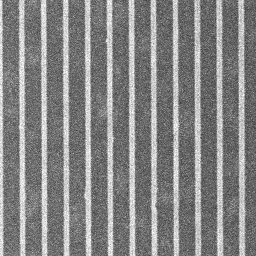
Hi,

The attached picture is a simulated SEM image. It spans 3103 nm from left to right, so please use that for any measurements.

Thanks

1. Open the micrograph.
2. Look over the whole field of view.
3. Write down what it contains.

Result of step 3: parallel lines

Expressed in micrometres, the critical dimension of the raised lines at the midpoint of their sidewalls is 0.053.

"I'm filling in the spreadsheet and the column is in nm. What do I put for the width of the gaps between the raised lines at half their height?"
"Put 214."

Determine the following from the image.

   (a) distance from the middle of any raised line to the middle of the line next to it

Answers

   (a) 266 nanometres